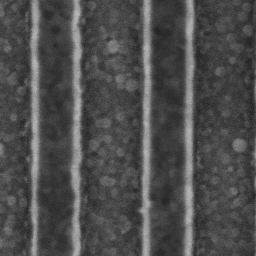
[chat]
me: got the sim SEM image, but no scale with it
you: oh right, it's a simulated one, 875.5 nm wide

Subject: one or a few lines or trenches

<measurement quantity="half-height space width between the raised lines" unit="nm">233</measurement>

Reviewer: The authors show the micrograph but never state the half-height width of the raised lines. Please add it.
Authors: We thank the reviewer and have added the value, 150 nanometres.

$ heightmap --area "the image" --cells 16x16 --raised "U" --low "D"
DDUUUDDDDUUUDDDD
DDUUUDDDDUUUDDDD
DDUUUDDDDUUUDDDD
DDUUUDDDDUUUDDDD
DDUUUDDDDUUUDDDD
DDUUUDDDDUUUDDDD
DDUUUDDDDUUUDDDD
DDUUUDDDDUUUDDDD
DDUUUDDDDUUUDDDD
DDUUUDDDDUUUDDDD
DDUUUDDDDUUUDDDD
DDUUUDDDDUUUDDDD
DDUUUDDDDUUUDDDD
DDUUUDDDDUUUDDDD
DDUUUDDDDUUUDDDD
DDUUUDDDDUUUDDDD